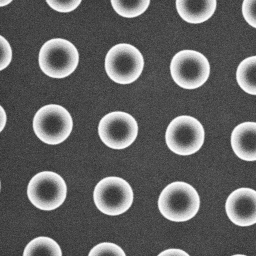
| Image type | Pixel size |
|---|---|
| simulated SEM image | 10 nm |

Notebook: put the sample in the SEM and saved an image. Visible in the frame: an array of small figures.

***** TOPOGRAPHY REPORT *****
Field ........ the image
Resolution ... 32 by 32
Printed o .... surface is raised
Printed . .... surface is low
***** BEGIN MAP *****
o.....oooo....ooooo...ooooo...oo
...............ooo....ooooo...oo
.......................ooo.....o
................................
................................
o.....ooo......o................
o....ooooo....ooo.....ooo.......
o....ooooo...ooooo....oooo.....o
o....oooo....ooooo...ooooo....oo
......oo......ooo....ooooo....oo
......................ooo.....oo
...............................o
................................
.....ooo........................
o...ooooo....ooo................
o...ooooo...ooooo....oooo.....oo
....ooooo...ooooo....oooo....ooo
.....ooo.....oooo....oooo....ooo
..............o......oooo....ooo
..............................oo
................................
.....o..........................
....oooo.....oo.................
....oooo....oooo.....ooo........
....oooo....ooooo...ooooo....ooo
....oooo....oooo....ooooo...oooo
.............oo.....ooooo...oooo
.....................oo......ooo
................................
................................
....ooo......o..................
...ooooo...oooo.....ooo.........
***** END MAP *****